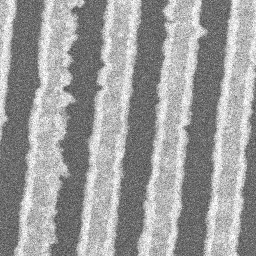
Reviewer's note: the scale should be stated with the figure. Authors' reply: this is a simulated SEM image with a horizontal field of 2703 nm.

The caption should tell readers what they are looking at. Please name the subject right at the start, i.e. one or a few lines or trenches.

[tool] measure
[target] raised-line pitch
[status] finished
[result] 650 nm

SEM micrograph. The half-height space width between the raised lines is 400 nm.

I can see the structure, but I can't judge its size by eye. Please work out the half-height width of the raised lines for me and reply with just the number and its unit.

245 nm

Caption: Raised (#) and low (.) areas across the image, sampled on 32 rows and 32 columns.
#.....####....###.....###....###
#.....###.....###....###.....###
#.....###.....##......##.....###
#.....###.....###....####....###
#.....###.....##.....###.....###
#.....###.....##.....###.....###
#.....##.....###.....###.....###
#....###.....###.....###.....###
.....###.....###.....###.....##.
.....###.....###.....###....###.
......##.....###.....##.....###.
.....###.....###.....##.....###.
.....###.....###.....##.....###.
.....###....####....###.....###.
.....###....###.....###.....###.
....###.....###.....###.....##..
....###.....###.....###.....##..
....###.....###.....###.....##..
....###.....###.....###....###..
....###.....###.....##.....###..
....###.....##.....###.....###..
....###.....###....###.....###..
....##.....####....###.....###..
....###....####....###.....###..
...####....####....###.....###..
...####....###.....###.....###..
...###.....###.....###.....###..
...###.....###.....###.....##...
...###.....###.....###.....##...
...###.....###.....##.....###...
...###....###.....###.....###...
...###....###.....###.....###...